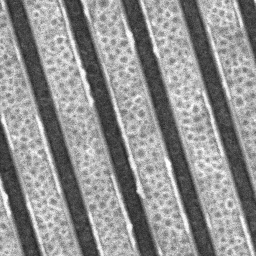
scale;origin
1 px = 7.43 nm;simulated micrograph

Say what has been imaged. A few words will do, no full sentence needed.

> parallel lines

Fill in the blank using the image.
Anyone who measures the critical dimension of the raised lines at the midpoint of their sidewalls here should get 0.275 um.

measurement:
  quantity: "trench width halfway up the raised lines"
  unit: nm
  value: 141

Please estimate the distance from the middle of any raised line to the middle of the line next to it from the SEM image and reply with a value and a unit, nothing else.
412 nm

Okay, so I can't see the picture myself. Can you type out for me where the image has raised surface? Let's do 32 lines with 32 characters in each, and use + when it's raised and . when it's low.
+..+++++..+++++...++++...+++++..
+..+++++...++++...+++++..+++++..
+...++++...+++++..+++++..+++++..
++..+++++..+++++...++++...++++..
++..+++++...+++++..+++++..+++++.
++...++++...+++++..+++++..+++++.
++...+++++..+++++..+++++...++++.
+++..+++++..+++++...++++...+++++
+++...++++...+++++..+++++..+++++
+++...+++++..+++++..+++++...++++
++++..+++++..+++++...++++...++++
++++..+++++...++++...+++++..++++
++++...+++++..+++++..+++++..++++
+++++..+++++..+++++...++++...+++
+++++..+++++...++++...+++++..+++
+++++...++++...+++++..+++++..+++
.++++...+++++..+++++..+++++...++
.+++++..+++++..+++++...+++++..++
.+++++...++++...+++++..+++++..++
..++++...+++++..+++++..+++++...+
..+++++..+++++..+++++...++++...+
..+++++..+++++...+++++..+++++..+
...++++...++++...+++++..+++++...
...+++++..+++++..+++++...++++...
+..+++++..+++++...++++...+++++..
+..+++++...++++...+++++..+++++..
+...++++...+++++..+++++...++++..
++..+++++..+++++..+++++...+++++.
++..+++++...+++++..+++++..+++++.
++...++++...+++++..+++++..+++++.
++...+++++..+++++..+++++...++++.
+++..+++++..+++++...+++++..+++++